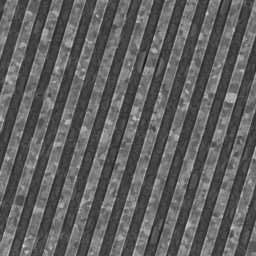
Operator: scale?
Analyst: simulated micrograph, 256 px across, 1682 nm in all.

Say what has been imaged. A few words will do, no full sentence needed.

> parallel lines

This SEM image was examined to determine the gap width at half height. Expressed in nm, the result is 77.7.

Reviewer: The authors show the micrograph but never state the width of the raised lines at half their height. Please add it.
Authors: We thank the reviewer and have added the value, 66 nanometres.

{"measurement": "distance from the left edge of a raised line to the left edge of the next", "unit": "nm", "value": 142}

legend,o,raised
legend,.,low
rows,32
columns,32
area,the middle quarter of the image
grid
...ooo...ooo...oo...ooo...ooo...
...ooo...oo...ooo...oo....oo...o
...oo....oo...ooo...oo...ooo...o
...oo...ooo...oo...ooo...ooo...o
..ooo...oo...ooo...ooo...oo...oo
..ooo...oo...ooo...oo...ooo...oo
..oo...ooo...oo...ooo...ooo...oo
.ooo...oo....oo...ooo...oo....oo
.ooo...oo...ooo...oo...ooo...ooo
.oo...ooo...ooo..ooo...ooo...oo.
ooo...ooo...oo...ooo...oo....oo.
ooo...oo...ooo...oo....oo...ooo.
oo...ooo...ooo...oo...ooo...oo..
oo...ooo...oo...ooo...ooo...oo..
oo...oo...ooo...ooo...oo...ooo..
oo...oo...ooo...oo...ooo...oo...
o...ooo...oo...ooo...ooo...oo...
o...oo....oo...ooo...oo...ooo...
o...oo...ooo...oo...ooo...ooo...
...ooo...ooo..ooo...ooo...oo...o
...oo....oo...ooo...oo....oo...o
...oo...ooo...oo....oo...ooo...o
...oo...ooo...oo...ooo...oo...oo
..ooo...oo...ooo...ooo...oo...oo
..oo...ooo...ooo...oo...ooo...oo
.ooo...ooo...oo...ooo...oo....oo
.ooo...oo...ooo...ooo...oo...ooo
.oo...ooo...ooo...oo...ooo...ooo
.oo...ooo...oo...ooo...ooo...oo.
ooo...oo...ooo...ooo...oo...ooo.
oo....oo...ooo...oo....oo...ooo.
oo...ooo...oo...ooo...ooo...oo..